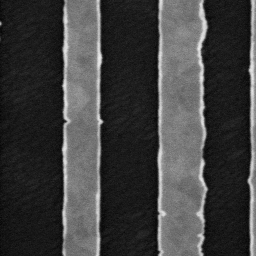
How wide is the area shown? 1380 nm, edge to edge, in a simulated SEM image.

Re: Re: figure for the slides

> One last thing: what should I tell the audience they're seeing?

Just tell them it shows one or a few lines or trenches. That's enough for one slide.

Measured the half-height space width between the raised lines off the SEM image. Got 293 nanometers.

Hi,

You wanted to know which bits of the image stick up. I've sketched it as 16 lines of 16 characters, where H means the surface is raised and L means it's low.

LLLLHHLLLLHHHLLL
LLLLHHLLLLHHHLLL
LLLLHHLLLLHHHLLL
LLLLHHLLLLHHHLLL
LLLLHHLLLLHHHLLL
LLLLHHLLLLHHHLLL
LLLLHHLLLLHHHLLL
LLLLHHLLLLHHHLLL
LLLLHHLLLLHHHLLL
LLLLHHLLLLHHHLLL
LLLLHHLLLLHHHLLL
LLLLHHLLLLHHHLLL
LLLLHHLLLLHHHLLL
LLLLHHLLLLHHHLLL
LLLLHHLLLLHHHLLL
LLLLHHLLLLHHHLLL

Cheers